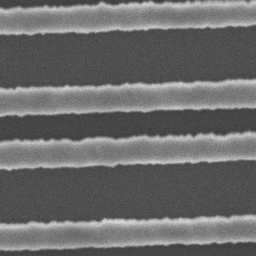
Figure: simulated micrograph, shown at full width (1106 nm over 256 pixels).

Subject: lines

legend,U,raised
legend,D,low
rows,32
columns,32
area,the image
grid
DDDDDDDDDDDDUDDDUUUUUUUUUUUUUUUU
UUUUUUUUUUUUUUUUUUUUUUUUUUUUUUUU
UUUUUUUUUUUUUUUUUUUUUUUUUUUUUUUU
UUUUUUUUUUUUUUUUUUUUUUUUUUDDDDDD
DDDDDDDDDDDDDDDDDDDDDDDDDDDDDDDD
DDDDDDDDDDDDDDDDDDDDDDDDDDDDDDDD
DDDDDDDDDDDDDDDDDDDDDDDDDDDDDDDD
DDDDDDDDDDDDDDDDDDDDDDDDDDDDDDDD
DDDDDDDDDDDDDDDDDDDDDDDDDDDDDDDD
DDDDDDDDDDDDDDDDDDDDDDDDDDDDDDDD
DDDDDDDDDDDDDDDDDUDDDUUUUUUUUUUU
UUUUUUUUUUUUUUUUUUUUUUUUUUUUUUUU
UUUUUUUUUUUUUUUUUUUUUUUUUUUUUUUU
UUUUUUUUUUUUUUUUUUUUUUUUUUUUUUDU
UDUDDDDDDDDDDDDDDDDDDDDDDDDDDDDD
DDDDDDDDDDDDDDDDDDDDDDDDDDDDDDDD
DDDDDDDDDDDDDDDDDDDDDDDDDDDDDDDD
DDDDDDUUUDUUUUUUUUUUUUUUUUUUUUUU
UUUUUUUUUUUUUUUUUUUUUUUUUUUUUUUU
UUUUUUUUUUUUUUUUUUUUUUUUUUUUUUUU
UUUUUUUUUUUUUUUUDDDDDDDDDDDDDDDD
DDDDDDDDDDDDDDDDDDDDDDDDDDDDDDDD
DDDDDDDDDDDDDDDDDDDDDDDDDDDDDDDD
DDDDDDDDDDDDDDDDDDDDDDDDDDDDDDDD
DDDDDDDDDDDDDDDDDDDDDDDDDDDDDDDD
DDDDDDDDDDDDDDDDDDDDDDDDDDDDDDDD
DDDDDDDDDDDDDDDDDDDDDDDDDDDDDDDD
DDDDDDDDDDDDDDDDDDDDUDUUUUUUUUUU
UUUUUUUUUUUUUUUUUUUUUUUUUUUUUUUU
UUUUUUUUUUUUUUUUUUUUUUUUUUUUUUUU
UUUUUUUUUUUUUUUUUUUUUUDUUUDDDDDD
DDDDDDDDDDDDDDDDDDDDDDDDDDDDDDDD